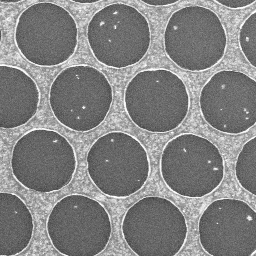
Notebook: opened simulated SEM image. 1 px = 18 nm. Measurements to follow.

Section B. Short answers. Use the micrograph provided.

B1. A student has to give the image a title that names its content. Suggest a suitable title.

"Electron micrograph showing a regular array of holes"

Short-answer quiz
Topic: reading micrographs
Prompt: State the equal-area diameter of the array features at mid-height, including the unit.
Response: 1150 nm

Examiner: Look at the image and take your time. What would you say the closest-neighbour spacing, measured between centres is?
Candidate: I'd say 1310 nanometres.